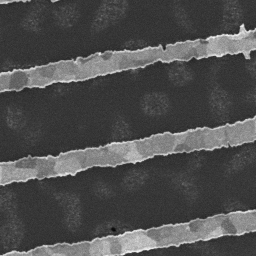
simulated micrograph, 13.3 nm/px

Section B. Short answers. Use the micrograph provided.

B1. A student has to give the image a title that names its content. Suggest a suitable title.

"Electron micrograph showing one or a few lines or trenches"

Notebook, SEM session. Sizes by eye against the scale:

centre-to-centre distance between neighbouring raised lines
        1200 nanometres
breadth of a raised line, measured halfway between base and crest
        0.269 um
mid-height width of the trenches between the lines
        919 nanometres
